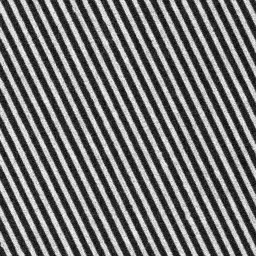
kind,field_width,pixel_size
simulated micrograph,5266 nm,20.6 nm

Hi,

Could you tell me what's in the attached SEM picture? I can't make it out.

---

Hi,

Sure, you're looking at parallel lines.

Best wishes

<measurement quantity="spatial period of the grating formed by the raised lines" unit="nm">230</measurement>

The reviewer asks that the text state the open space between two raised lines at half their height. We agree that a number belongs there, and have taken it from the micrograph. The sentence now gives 162 nm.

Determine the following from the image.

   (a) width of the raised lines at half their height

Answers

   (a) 0.081 µm